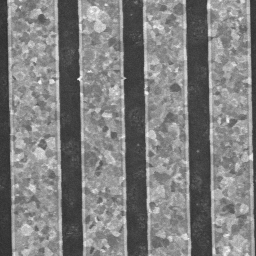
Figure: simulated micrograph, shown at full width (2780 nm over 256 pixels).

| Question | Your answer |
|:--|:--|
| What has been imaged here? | one or a few lines or trenches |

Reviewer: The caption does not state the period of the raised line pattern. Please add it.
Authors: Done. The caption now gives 709 nm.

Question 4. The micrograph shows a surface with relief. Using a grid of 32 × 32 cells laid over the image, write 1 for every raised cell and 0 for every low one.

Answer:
01111110001111100011111000111110
01111110001111100011111000111110
01111110001111100011111000111110
01111110001111100011111000111110
01111110001111100011111000111110
01111110001111100011111000111110
01111110001111100011111000111110
01111110001111100011111000111110
01111110001111100011111000111110
01111110001111100011111000111110
01111110001111100011111000111110
01111110001111100011111000111110
01111110001111100011111000111110
01111110001111100011111000111110
01111110001111100011111000111110
01111110001111100011111000111110
01111110001111100011111000111110
00111110001111100011111000111110
00111110001111100011111000111110
00111110001111100011111000111110
00111110001111100011111000111110
00111110001111110001111000011110
00111110001111110001111000011110
00111110001111110001111000011110
00111110001111110001111000011110
00111110001111110001111000011110
00111110001111110001111000011110
00111111000111110001111100011111
00111111000111110001111100011111
00111111000111110001111100011111
00111111000111110001111100011111
00111111000111110001111100011111